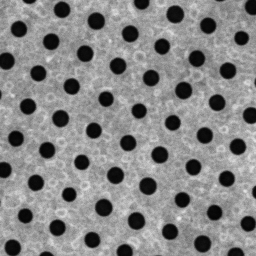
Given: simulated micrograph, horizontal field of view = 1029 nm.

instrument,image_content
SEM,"a regular array of holes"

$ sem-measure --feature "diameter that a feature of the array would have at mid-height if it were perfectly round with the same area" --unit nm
66.4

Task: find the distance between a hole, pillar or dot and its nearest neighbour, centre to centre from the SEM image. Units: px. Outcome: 34